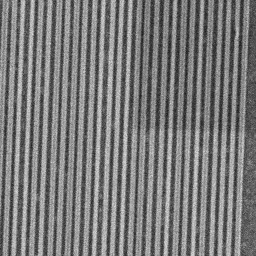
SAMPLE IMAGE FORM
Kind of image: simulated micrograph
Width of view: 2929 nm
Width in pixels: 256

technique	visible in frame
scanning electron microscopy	parallel lines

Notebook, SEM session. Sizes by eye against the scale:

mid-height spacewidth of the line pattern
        4.37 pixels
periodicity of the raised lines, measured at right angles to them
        102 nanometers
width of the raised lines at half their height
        50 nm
